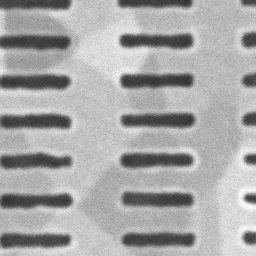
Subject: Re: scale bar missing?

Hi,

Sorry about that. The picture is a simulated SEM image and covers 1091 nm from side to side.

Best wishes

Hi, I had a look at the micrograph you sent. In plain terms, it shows holes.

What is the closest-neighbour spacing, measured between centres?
0.169 µm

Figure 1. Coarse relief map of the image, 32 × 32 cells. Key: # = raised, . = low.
.........######.........######..
################################
################################
################################
........#######.........######..
.........######.........######..
################################
################################
################################
........#######.........######..
.........######.........######..
################################
################################
################################
.........######.........######..
.........######.........######..
################################
################################
################################
.........######.........######..
.........######.........#######.
################################
################################
################################
.........######.........######..
.........######.........#######.
################################
################################
################################
.........######..........#####..
.........######.........#######.
################################